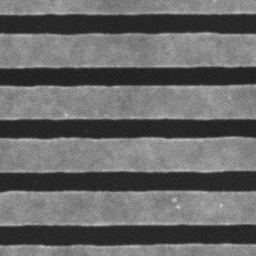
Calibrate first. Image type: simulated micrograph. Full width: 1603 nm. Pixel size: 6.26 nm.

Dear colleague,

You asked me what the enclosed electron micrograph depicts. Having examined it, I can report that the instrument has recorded lines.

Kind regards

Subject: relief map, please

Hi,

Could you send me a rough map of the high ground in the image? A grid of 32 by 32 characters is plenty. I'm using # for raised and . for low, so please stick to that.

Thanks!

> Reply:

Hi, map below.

################################
################################
................................
................................
################################
################################
################################
################################
................................
................................
................................
################################
################################
################################
################################
................................
................................
################################
################################
################################
################################
....##..........................
................................
................................
################################
################################
################################
################################
................................
................................
................................
################################